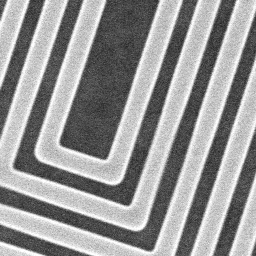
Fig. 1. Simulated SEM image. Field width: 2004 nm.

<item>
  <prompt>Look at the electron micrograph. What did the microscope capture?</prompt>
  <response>groups of lines, slits or small figures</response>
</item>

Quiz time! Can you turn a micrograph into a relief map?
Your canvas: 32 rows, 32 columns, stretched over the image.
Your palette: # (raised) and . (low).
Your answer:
.##...##..###.......###..##..###
.##..###..###.......##..###..###
###..###..##.......###..###..###
##...##..###.......###..##..###.
##..###..###.......##..###..###.
##..###..##.......###..###..##..
#...##..###.......###..##...##..
#..###..###.......##..###..###..
#..###..##.......###..###..##...
#..##..###.......###..##...##..#
..###..###.......##..###..###..#
..###..##.......###..###..##...#
..##..###.......##...##...##..##
.###..###.......##...##..###..##
.###..##.......###..###..###..##
.##...##.......##...##...##..###
###..###.......##...##..###..###
##...##.......###..###..###..##.
##...###......###..##...##..###.
##...######...##...##..###..###.
##....##########..###..##...##..
##.......#######..##...##..###..
######......###...##..###..###..
.########........###..##...##...
....########.....##...##..###..#
.......########..##..###..###..#
###.......#########..##...##...#
######.......#####...##..###..##
..#######.......##..###..###..##
....########........##...##...##
#......########.....##..###..###
####......########.###..###..##.